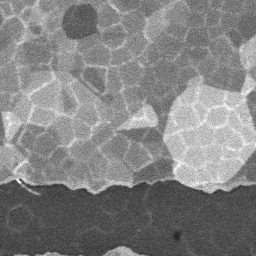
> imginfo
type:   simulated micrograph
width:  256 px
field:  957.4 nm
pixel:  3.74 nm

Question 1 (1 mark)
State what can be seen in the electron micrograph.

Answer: one or a few lines or trenches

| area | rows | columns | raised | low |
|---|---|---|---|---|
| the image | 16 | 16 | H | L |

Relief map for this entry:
HHHHHHHHHHHHHHHH
HHHHHHHHHHHHHHHH
HHHHHHHHHHHHHHHH
HHHHHHHHHHHHHHHH
HHHHHHHHHHHHHHHH
HHHHHHHHHHHHHHHH
HHHHHHHHHHHHHHHH
HHHHHHHHHHHHHHHH
HHHHHHHHHHHHHHHH
HHHHHHHHHHHHHHHH
HHHHHHHHHHHHHHHH
LLHLHHHHLLLHHHHL
LLLLLLLLLLLLLLLL
LLLLLLLLLLLLLLLL
LLLLLLLLLLLLLLLL
LLLLLLLHLLLLLLLL